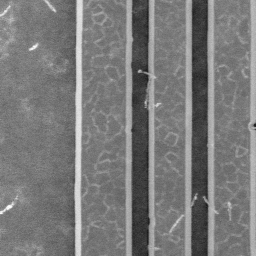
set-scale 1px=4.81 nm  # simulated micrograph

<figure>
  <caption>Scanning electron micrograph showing one or a few lines or trenches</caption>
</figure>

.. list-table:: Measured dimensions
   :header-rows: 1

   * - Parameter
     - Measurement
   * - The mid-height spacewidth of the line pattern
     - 106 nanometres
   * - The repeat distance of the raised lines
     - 310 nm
